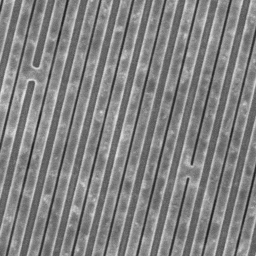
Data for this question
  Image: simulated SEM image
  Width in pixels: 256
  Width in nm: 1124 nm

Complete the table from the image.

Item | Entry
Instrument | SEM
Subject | parallel lines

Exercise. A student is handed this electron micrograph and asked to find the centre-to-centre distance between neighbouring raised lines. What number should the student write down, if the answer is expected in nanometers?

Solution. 69.4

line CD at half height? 0.0469 um